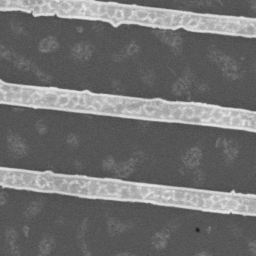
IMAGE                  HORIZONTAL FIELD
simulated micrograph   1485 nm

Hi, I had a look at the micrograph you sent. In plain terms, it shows one or a few lines or trenches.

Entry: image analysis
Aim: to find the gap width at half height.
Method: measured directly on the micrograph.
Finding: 390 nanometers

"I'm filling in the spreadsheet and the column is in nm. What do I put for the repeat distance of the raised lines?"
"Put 503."